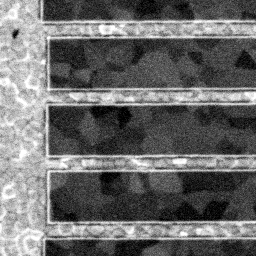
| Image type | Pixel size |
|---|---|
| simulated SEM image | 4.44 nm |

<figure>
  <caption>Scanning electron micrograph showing one or a few lines or trenches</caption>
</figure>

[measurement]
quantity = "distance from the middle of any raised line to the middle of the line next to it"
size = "296 nanometers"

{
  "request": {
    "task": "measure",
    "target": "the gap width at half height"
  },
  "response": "66.6 nanometres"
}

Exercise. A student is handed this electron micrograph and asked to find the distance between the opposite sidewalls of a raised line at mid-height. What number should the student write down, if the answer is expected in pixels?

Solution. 52